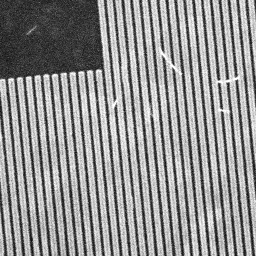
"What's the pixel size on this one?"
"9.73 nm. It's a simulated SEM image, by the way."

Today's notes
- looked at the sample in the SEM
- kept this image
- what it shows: parallel lines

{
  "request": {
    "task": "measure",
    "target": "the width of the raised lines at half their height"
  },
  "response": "0.0423 µm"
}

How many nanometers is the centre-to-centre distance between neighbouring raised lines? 85.6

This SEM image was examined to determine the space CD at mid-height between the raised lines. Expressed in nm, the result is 42.3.